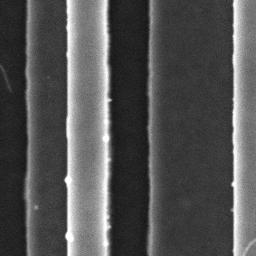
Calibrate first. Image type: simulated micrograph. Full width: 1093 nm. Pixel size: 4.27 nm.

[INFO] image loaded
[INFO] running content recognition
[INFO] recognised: lines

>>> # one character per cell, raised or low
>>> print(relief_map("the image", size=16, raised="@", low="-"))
--@@@@@--@@@@@@@
--@@@@@--@@@@@@@
--@@@@@--@@@@@@@
--@@@@@--@@@@@@@
--@@@@@--@@@@@@@
--@@@@@--@@@@@@@
--@@@@@--@@@@@@@
--@@@@@--@@@@@@@
--@@@@@--@@@@@@@
--@@@@@--@@@@@@@
--@@@@@--@@@@@@@
--@@@@@--@@@@@@@
--@@@@@--@@@@@@@
--@@@@@--@@@@@@@
--@@@@@--@@@@@@@
--@@@@@--@@@@@@@